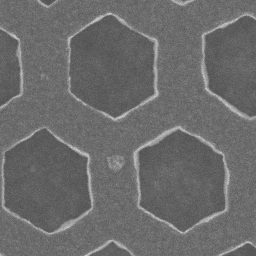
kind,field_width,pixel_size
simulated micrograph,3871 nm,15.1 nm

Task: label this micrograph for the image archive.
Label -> holes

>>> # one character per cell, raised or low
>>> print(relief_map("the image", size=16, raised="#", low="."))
################
######..######..
.####....####...
.###......###...
.###......###...
.###......###...
#####....#####..
################
##.#######..####
.....####.....##
.....####.....##
......###.....##
......###.....##
#....#####...###
################
######..#######.